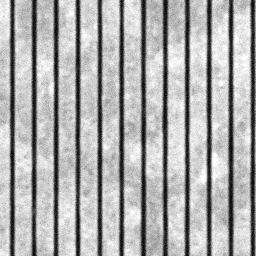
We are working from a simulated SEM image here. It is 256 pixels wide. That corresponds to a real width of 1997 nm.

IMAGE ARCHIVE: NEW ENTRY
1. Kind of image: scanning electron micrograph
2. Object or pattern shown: parallel lines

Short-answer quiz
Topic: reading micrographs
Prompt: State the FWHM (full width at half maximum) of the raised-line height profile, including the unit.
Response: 124 nm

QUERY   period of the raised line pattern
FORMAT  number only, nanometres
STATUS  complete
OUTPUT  170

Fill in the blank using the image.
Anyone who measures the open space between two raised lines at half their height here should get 42.9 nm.